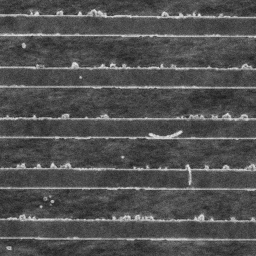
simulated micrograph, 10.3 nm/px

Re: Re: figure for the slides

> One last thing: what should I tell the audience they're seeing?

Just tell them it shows lines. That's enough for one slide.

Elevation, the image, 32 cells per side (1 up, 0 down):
00000000000000000000000000000000
00000000000000000000000000000000
11111111111111111111111111111111
11111111111111111111111111111111
00000000000000010001111111111111
00000000000000000000000000000000
00000000000000000000000000000000
00000000000000000000000000000000
11111000010011000001000000000000
11111111111111111111111111111111
11111111111111111111111111111111
00000000000000000000000000000000
00000000000000000000000000000000
00000000000000000000000000000000
00000000000000000000000000000000
11111111111111111111111111111111
11111111111111111111111111111111
00000000000000000000000000000000
00000000000000000000000000000000
00000000000000000000000000000000
00000000000000000000000000000000
11111111111111111111111111111111
11111111111111111111111111111111
11111111111111111111111111111111
00000000000000000000000000000000
00000000000000000000000000000000
00000000000000000000000000000000
11110111100000011100000001000000
11111111111111111111111111111111
11111111111111111111111111111111
00000000000000000000000000000000
00000000000000000000000000000000